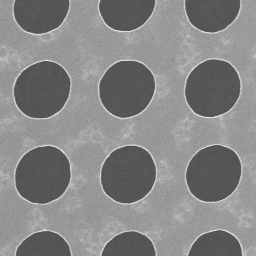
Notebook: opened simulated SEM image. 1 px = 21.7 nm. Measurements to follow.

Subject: holes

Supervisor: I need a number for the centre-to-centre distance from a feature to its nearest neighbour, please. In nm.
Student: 1850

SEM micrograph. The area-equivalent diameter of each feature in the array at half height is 1230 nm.